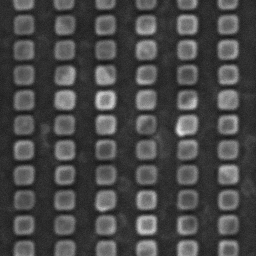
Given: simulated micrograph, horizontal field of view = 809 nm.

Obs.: a regular array of raised bodies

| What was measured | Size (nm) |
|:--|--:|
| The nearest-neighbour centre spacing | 78.8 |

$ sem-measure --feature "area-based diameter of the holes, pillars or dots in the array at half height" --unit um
0.0621